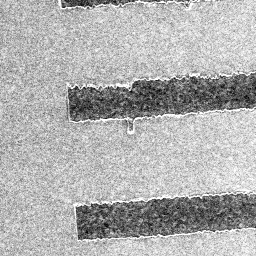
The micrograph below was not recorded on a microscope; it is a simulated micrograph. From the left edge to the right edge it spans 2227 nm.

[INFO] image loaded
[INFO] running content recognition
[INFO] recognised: one or a few lines or trenches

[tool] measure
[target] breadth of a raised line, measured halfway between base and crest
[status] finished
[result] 36.7 px